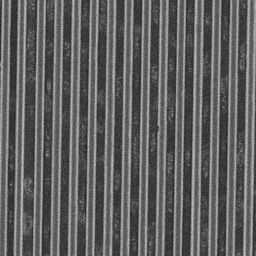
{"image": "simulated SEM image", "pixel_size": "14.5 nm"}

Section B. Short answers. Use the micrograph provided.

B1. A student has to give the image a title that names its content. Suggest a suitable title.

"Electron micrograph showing parallel lines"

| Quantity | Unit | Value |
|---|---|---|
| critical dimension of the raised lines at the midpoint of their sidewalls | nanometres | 105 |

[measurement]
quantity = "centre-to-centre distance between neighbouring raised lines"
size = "255 nm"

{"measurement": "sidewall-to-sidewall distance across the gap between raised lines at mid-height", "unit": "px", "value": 10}